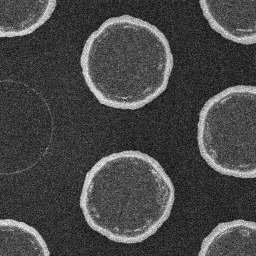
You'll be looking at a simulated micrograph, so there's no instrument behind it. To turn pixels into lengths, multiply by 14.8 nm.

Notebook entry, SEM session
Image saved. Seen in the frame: raised bodies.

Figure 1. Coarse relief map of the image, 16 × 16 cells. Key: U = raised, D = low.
UUUDDDDDDDDDDUUU
UUDDDDDUUDDDDUUU
DDDDDDUUUUDDDDDU
DDDDDUUUUUUDDDDD
DDDDDUUUUUUDDDDD
DDDDDDUUUUDDDDDD
DDDDDDDUUDDDDUUU
DDDDDDDDDDDDDUUU
DDDDDDDDDDDDUUUU
DDDDDDDDDDDDDUUU
DDDDDDUUUUDDDDUU
DDDDDUUUUUUDDDDD
DDDDDUUUUUUDDDDD
DDDDDUUUUUDDDDDD
UUDDDDUUUDDDDDUU
UUUDDDDDDDDDDUUU